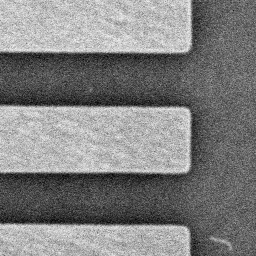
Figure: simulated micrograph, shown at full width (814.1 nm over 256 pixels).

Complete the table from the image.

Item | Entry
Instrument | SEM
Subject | wiring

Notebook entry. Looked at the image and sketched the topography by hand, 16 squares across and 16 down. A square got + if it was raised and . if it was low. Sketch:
++++++++++++....
++++++++++++....
++++++++++++....
................
................
................
................
++++++++++++....
++++++++++++....
++++++++++++....
++++++++++++....
................
................
................
++++++++++++....
++++++++++++....